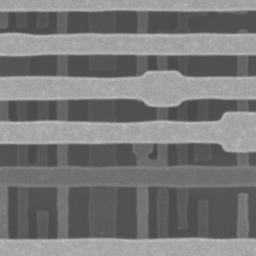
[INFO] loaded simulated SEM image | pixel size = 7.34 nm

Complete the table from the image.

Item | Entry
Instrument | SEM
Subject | wiring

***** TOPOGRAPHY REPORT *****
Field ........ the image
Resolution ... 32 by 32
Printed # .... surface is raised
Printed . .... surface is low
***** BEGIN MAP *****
################################
................................
................................
................................
################################
################################
################################
................................
................................
.................######.........
################################
################################
#######..........#######........
................................
............................####
################################
################################
################################
............................####
................................
................................
################################
################################
................................
................................
................................
................................
................................
................................
................................
################################
################################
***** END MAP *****